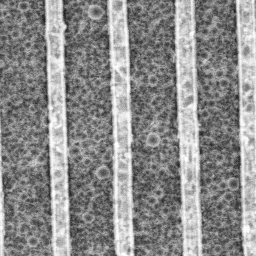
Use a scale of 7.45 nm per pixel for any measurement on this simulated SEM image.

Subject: one or a few lines or trenches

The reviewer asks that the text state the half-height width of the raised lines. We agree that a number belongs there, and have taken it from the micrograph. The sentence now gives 104 nm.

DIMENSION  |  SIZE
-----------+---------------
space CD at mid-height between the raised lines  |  0.38 micrometres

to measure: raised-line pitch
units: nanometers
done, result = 482